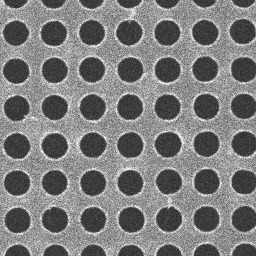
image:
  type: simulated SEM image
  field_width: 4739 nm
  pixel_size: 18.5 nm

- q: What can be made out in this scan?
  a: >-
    a regular array of holes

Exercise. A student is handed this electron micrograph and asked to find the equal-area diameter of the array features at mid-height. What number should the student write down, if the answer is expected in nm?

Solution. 485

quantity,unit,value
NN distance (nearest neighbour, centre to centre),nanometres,685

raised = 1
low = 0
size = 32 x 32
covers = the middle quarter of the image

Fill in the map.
01110000001110000000111000000111
01110000001110000000111000000111
01110000001110000000111000000111
11111000001111000001111000000111
11111100111111100011111110011111
11111111111111111111111111111111
11111111111111111111111111111111
11111111111111110111111110111111
11111000001111000001111100001111
01110000001110000000111000000111
01110000000110000000111000000111
01110000000110000000111000000111
11110000001111000001111000000111
11111000011111100011111100001111
11111111111111111111111111111111
11111111111111111111111111111111
11111111111111111111111111111111
11111100011111100011111100001111
11111000001111000001111000000111
01110000000110000000111000000111
01110000000110000000111000000111
01110000001111000000111000000111
11111000001111000001111100001111
11111110111111101111111111111111
11111111111111111111111111111111
11111111111111111111111111111111
11111110111111110111111110001111
11111000001111000001111100000111
01110000001111000000111000000111
01110000000110000000111000000011
01110000001110000000111000000111
11110000001111000001111100000111